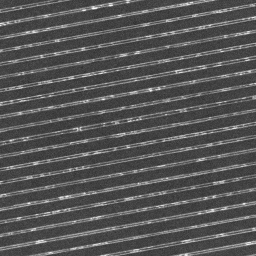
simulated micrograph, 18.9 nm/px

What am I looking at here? parallel lines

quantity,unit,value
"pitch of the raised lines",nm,245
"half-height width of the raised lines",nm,44.1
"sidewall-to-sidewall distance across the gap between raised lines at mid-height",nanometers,204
